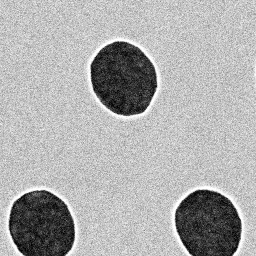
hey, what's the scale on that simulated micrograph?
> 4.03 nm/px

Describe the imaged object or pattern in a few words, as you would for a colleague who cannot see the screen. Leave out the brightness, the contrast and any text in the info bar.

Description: holes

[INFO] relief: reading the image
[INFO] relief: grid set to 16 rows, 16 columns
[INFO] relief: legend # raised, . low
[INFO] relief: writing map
################
################
################
######...#######
######....######
######....######
######...#######
################
################
################
################
################
#...#######...##
#...#######....#
#....######....#
#...########...#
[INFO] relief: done